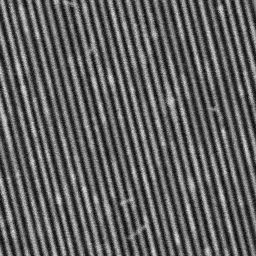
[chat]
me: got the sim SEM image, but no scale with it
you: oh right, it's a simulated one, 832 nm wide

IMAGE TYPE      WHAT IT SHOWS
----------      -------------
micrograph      parallel lines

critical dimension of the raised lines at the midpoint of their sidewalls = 13.8 nanometers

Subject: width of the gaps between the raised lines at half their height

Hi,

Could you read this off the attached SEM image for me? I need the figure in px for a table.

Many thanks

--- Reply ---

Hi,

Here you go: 5.11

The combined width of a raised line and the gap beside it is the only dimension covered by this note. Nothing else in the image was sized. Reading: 28.5 nanometres